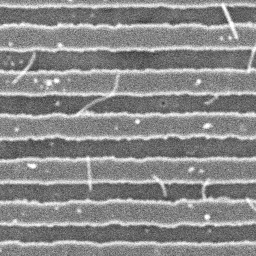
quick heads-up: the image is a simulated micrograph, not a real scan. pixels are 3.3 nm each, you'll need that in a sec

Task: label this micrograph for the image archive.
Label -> lines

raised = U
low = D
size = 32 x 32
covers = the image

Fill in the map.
UUUUUUUUUUUUUUUUUUUUUUUUUUUUUUUU
DDDDDDDDDDDDDDDDDDDDDDDDDDDDDDDD
DDDDDDDDDDDDDDDDDDDDDDDDDDDDDDDD
UUUUUUUUUUUUUUUUUUUUUUUUUUUUUUUU
UUUUUUUUUUUUUUUUUUUUUUUUUUUUUUUU
UUUUUUUUUUUUUUUUUUUUUUUUUUUUUUUU
DDDDDDUDDDDDDDDDDDDDDDDDDDDDDDDD
DDDDDDDDDDDDDDDDDDDDDDDDDDDDDDDD
DDDDDDDDDDDDDDDDDDDDDDDDDDDDDDDD
UUUUUUUUUUUUUUUUUUUUUUUUUUUUUUUU
UUUUUUUUUUUUUUUUUUUUUUUUUUUUUUUU
UUUUUUUUUUUUUUUUUUUUUUUUUUUUUUUU
DDDDDDDDDDDDDDDDDDDDDDDDDDDDDDDD
DDDDDDDDDDDDDDDDDDDDDDDDDDDDDDDD
UUUUDUUUUUUUUUUUUUUUUUUUUUUUUUUU
UUUUUUUUUUUUUUUUUUUUUUUUUUUUUUUU
UUUUUUUUUUUUUUUUUUUUUUUUUUUUUUUU
DUDDDDDDDUDDDDDDDDDDDDDDDDDDDDDD
DDDDDDDDDDDDDDDDDDDDDDDDDDDDDDDD
DDDDDDDDDDDDDDDDDDDDDDDDDDDDDDDD
UUUUUUUUUUUUUUUUUUUUUUUUUUUUUUUU
UUUUUUUUUUUUUUUUUUUUUUUUUUUUUUUU
UUUUUUUUUUUUUUUUUUUUUUUUUUUUUUUU
DDDDDDDDDDDDDDDDDDDDDDDDDDDDDDDD
DDDDDDDDDDDDDDDDDDDDDDDDDDDDDDDD
UUUUUUUUUUUUUUUUUUUUUUUUUUUUUUUU
UUUUUUUUUUUUUUUUUUUUUUUUUUUUUUUU
UUUUUUUUUUUUUUUUUUUUUUUUUUUUUUUU
DDDDDDDDDDDDDDDDDDDDDDDDDDDDDDDD
DDDDDDDDDDDDDDDDDDDDDDDDDDDDDDDD
UUUUUUUUUUUUDUUUUUUUUUUUUUUUUUUU
UUUUUUUUUUUUUUUUUUUUUUUUUUUUUUUU